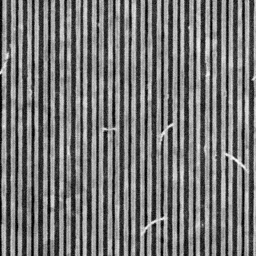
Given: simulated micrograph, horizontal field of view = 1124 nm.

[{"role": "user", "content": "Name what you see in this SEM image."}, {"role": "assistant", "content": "parallel lines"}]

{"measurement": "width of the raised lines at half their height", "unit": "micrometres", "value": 0.0126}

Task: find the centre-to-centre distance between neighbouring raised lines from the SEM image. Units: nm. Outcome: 35.5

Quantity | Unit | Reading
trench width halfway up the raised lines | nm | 25.2